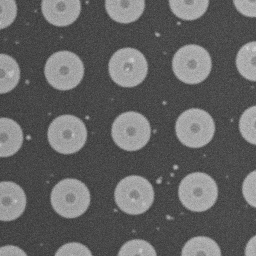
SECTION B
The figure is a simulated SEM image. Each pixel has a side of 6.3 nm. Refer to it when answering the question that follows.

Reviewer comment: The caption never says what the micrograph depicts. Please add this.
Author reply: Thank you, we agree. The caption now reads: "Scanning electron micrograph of an array of small figures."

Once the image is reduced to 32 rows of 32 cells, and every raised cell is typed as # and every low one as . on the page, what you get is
##...#####...#####...#####...###
##...#####...#####....####....##
##....###.....###...............
................................
................................
...............................#
.......##......##.....####....##
##....####....####....####....##
##....####....####....####....##
##....####....####....####....##
##....####.....##...............
#...............................
................................
...............................#
........#......###....####....##
##....####....#####...#####...##
###...#####...#####...#####...##
###...#####...#####...####.....#
##.....###.....###..............
#...............................
................................
................................
........##.....###.....####....#
###....####...#####...#####...##
###...#####...#####...#####...##
###...#####....####....####....#
###....####.....##..............
##..............................
................................
................................
........##......###....####....#
###....####....####....#####...#